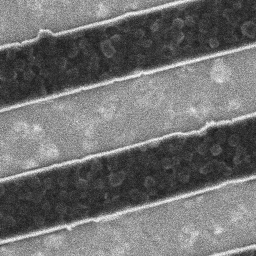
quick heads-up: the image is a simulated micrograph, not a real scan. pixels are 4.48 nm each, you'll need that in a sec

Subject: one or a few lines or trenches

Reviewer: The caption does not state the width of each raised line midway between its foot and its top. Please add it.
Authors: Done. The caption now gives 276 nanometres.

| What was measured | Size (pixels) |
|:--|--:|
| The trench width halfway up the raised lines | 66.2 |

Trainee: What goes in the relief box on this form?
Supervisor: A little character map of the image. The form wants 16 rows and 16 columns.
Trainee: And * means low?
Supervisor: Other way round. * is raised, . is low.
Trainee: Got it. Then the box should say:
..........******
......**********
..**************
*************...
**********......
******..........
**..............
..............**
..........******
.......*********
...*************
**************..
***********.....
*******.........
***.............
...............*